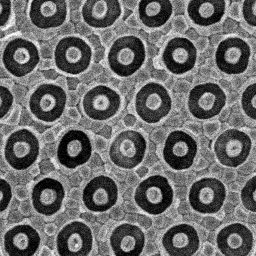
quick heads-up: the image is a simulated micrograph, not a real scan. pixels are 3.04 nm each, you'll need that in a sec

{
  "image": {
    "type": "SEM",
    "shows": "a regular array of ring-shaped grooves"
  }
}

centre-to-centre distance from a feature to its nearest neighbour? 52.1 pixels